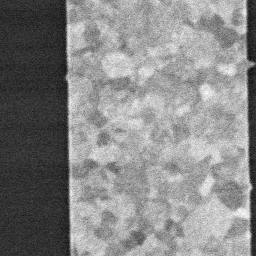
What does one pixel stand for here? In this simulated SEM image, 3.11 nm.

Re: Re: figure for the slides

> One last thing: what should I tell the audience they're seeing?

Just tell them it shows one or a few lines or trenches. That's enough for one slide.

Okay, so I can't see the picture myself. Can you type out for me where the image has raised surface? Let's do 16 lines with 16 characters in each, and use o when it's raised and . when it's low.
....ooooooooooo.
....ooooooooooo.
....ooooooooooo.
....ooooooooooo.
....ooooooooooo.
....ooooooooooo.
....ooooooooooo.
....ooooooooooo.
....ooooooooooo.
....ooooooooooo.
....oooooooooooo
....oooooooooooo
....oooooooooooo
....oooooooooooo
....oooooooooooo
....oooooooooooo